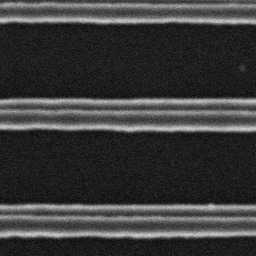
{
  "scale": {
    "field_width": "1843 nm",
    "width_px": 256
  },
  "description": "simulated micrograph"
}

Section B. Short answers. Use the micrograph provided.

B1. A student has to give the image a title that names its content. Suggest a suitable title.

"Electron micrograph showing lines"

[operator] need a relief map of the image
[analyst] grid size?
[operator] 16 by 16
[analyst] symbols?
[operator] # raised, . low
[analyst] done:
################
................
................
................
................
................
################
################
................
................
................
................
................
################
################
................